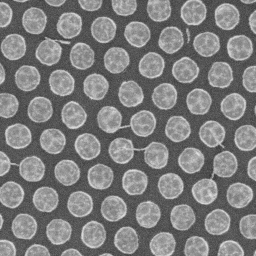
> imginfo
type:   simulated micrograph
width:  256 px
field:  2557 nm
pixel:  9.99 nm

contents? a regular array of raised bodies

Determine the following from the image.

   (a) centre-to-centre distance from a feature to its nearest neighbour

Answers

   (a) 334 nm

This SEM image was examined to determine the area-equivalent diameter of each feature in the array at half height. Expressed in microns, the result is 0.246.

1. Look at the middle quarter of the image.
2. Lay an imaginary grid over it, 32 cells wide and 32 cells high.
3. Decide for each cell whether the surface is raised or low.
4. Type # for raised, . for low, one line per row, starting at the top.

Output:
...####...######...######...####
...........####....######..#####
#...................####...#####
##....####..................####
##...######.....#.............#.
##...######...#####.....###.....
##...######...#####....#####....
#.....####....######..######...#
.......##.....######..######...#
..............#####....#####...#
####............#......####....#
#####....####...................
#####....#####....####..........
#####....#####...#####.....##...
#####....#.###...######...#####.
.###.....#####...######...#####.
..........###....#####...######.
.....#............###.....#####.
....####..................####..
...######...####................
...######...#####....####.......
...######..#######..######....##
....####....#####...######...###
......#.....#####...######...###
##...........##......#####...###
###.....##............###....###
####...#####..................##
####..######...#####......##....
####..######...######...#####...
###...######...######...######..
.......####....#####....######..
................####....#####...